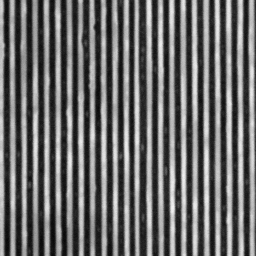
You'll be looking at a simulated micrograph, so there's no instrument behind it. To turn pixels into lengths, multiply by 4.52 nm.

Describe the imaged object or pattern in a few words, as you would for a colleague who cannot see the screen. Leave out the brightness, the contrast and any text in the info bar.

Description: parallel lines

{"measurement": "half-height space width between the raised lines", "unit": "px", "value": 6.99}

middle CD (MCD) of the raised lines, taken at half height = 19.8 nanometers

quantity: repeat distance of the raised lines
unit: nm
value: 51.5